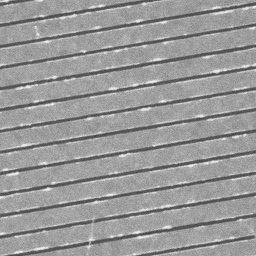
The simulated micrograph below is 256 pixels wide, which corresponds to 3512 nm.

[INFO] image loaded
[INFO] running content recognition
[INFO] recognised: parallel lines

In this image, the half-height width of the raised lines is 230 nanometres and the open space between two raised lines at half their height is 57.6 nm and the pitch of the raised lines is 287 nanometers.